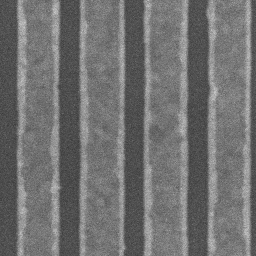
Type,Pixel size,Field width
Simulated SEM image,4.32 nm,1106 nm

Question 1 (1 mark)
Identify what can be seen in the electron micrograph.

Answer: one or a few lines or trenches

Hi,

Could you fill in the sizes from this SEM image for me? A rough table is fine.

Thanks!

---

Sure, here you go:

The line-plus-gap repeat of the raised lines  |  275 nm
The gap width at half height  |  112 nm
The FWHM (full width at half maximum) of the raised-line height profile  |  163 nanometers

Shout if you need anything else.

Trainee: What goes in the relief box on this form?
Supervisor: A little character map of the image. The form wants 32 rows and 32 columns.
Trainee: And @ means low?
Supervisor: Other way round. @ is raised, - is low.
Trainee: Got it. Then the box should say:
---@@@@---@@@@@---@@@@@---@@@@@-
---@@@@---@@@@@---@@@@@---@@@@@-
---@@@@---@@@@@---@@@@@---@@@@@-
---@@@@---@@@@@---@@@@@---@@@@@-
---@@@@---@@@@@---@@@@@---@@@@@-
---@@@@---@@@@@---@@@@@---@@@@@-
---@@@@---@@@@@----@@@@----@@@@-
---@@@@---@@@@@----@@@@----@@@@-
---@@@@---@@@@@----@@@@---@@@@@-
---@@@@---@@@@@----@@@@---@@@@@-
--@@@@@---@@@@@----@@@@----@@@@-
--@@@@@---@@@@@---@@@@@----@@@@-
---@@@@---@@@@@---@@@@@---@@@@@-
---@@@@---@@@@@---@@@@@---@@@@@-
---@@@@---@@@@@---@@@@@---@@@@@-
---@@@@---@@@@@---@@@@@---@@@@@-
---@@@@---@@@@@---@@@@@---@@@@@-
---@@@@----@@@@---@@@@@---@@@@@-
--@@@@@----@@@@---@@@@@---@@@@@-
--@@@@@---@@@@@---@@@@@---@@@@@-
--@@@@@---@@@@@---@@@@@---@@@@@-
--@@@@@---@@@@@---@@@@@---@@@@@-
--@@@@@---@@@@@---@@@@@---@@@@@-
--@@@@@---@@@@@---@@@@@---@@@@@-
---@@@@---@@@@@---@@@@@---@@@@@-
---@@@@---@@@@@---@@@@@---@@@@@-
---@@@@---@@@@@---@@@@@---@@@@@-
---@@@@---@@@@@---@@@@@---@@@@@-
---@@@@---@@@@@---@@@@@---@@@@@-
---@@@@---@@@@@----@@@@---@@@@@-
---@@@@---@@@@@---@@@@@---@@@@@-
---@@@@---@@@@@---@@@@@---@@@@@-